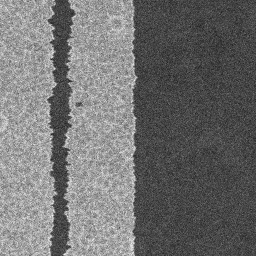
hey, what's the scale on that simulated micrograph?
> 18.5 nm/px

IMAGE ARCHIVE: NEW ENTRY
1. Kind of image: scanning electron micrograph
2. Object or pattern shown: one or a few lines or trenches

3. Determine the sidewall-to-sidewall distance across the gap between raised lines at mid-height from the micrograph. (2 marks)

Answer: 317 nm